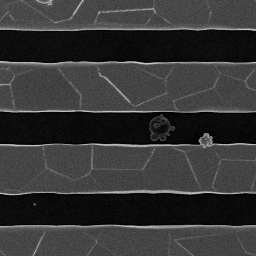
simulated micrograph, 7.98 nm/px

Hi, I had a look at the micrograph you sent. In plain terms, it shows wiring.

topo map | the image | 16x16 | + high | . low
++++++++++++++++
++++++++++++++++
................
................
++++++++++++++++
++++++++++++++++
++++++++++++++++
................
................
++++++++++++++++
++++++++++++++++
++++++++++++++++
................
................
++++++++++++++++
++++++++++++++++